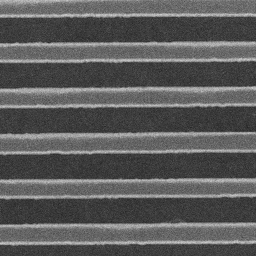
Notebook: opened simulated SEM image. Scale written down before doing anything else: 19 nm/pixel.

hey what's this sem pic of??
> lines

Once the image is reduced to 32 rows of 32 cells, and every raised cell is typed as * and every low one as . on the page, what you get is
********************************
********************************
................................
................................
................................
********************************
********************************
********************************
................................
................................
................................
********************************
********************************
................................
................................
................................
................................
********************************
********************************
................................
................................
................................
...**.**************************
********************************
********************************
................................
................................
................................
********************************
********************************
.***............................
................................